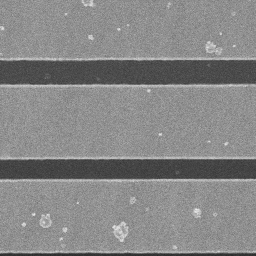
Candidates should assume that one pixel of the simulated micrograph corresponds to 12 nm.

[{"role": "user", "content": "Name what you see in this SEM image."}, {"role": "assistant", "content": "lines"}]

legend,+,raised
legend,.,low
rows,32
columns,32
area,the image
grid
++++++++++++++++++++++++++++++++
++++++++++++++++++++++++++++++++
++++++++++++++++++++++++++++++++
++++++++++++++++++++++++++++++++
++++++++++++++++++++++++++++++++
++++++++++++++++++++++++++++++++
++++++++++++++++++++++++++++++++
+++...+++++......+..............
................................
................................
................................
++++++++++++++++++++++++++++++++
++++++++++++++++++++++++++++++++
++++++++++++++++++++++++++++++++
++++++++++++++++++++++++++++++++
++++++++++++++++++++++++++++++++
++++++++++++++++++++++++++++++++
++++++++++++++++++++++++++++++++
++++++++++++++++++++++++++++++++
++++++++++++++++++++++++++++++++
................................
................................
++++++++++++++++++++++++++++++++
++++++++++++++++++++++++++++++++
++++++++++++++++++++++++++++++++
++++++++++++++++++++++++++++++++
++++++++++++++++++++++++++++++++
++++++++++++++++++++++++++++++++
++++++++++++++++++++++++++++++++
++++++++++++++++++++++++++++++++
++++++++++++++++++++++++++++++++
++++++++++++++++++++++++++++++++